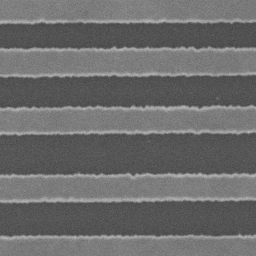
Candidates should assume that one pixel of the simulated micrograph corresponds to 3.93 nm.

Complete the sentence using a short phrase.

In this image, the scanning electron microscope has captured lines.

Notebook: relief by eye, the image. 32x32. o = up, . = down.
oooooooooooooooooooooooooooooooo
oooooooooooooooooooooooooooooooo
oooooooooooooooooooooooooooooooo
................................
................................
................................
oooooooooooooooooooooooooooooooo
oooooooooooooooooooooooooooooooo
oooooooooooooooooooooooooooooooo
o.ooo.oo........................
................................
................................
................................
..o.o.o.oooooooooooooooooooooooo
oooooooooooooooooooooooooooooooo
oooooooooooooooooooooooooooooooo
oooooooooooooooooooooooooooooooo
................................
................................
................................
................................
................................
oooooooooooooooooooooooooooooooo
oooooooooooooooooooooooooooooooo
oooooooooooooooooooooooooooooooo
................................
................................
................................
................................
.......................o.....o.o
oooooooooooooooooooooooooooooooo
oooooooooooooooooooooooooooooooo